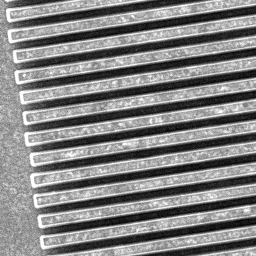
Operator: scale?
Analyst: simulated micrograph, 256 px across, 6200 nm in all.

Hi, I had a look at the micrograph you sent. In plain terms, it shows parallel lines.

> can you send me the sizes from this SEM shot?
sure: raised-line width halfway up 290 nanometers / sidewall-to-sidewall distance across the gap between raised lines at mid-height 0.21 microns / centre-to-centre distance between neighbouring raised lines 502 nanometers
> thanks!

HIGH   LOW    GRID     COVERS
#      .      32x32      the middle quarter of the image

#################...............
###########...............######
####...............#############
.............###################
......###################.......
###################.............
############.................###
#####.................##########
...............#################
.........#################......
.###################............
#############.................##
#######................#########
.................###############
..........###################...
...###################..........
################...............#
#########.................######
###................#############
.............###################
......###################.......
#################...............
############...............#####
#####...............############
..............##################
.......###################......
####################............
#############...............####
######................##########
...............#################
........###################.....
..###################...........